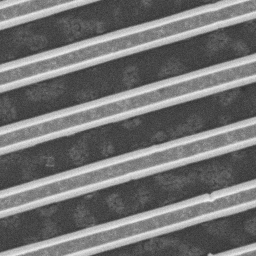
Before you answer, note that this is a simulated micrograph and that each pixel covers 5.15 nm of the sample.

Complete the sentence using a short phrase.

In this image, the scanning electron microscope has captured parallel lines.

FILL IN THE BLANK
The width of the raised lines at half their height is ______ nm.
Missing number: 101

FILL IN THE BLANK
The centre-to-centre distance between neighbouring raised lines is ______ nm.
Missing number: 311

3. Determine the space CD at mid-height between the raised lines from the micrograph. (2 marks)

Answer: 211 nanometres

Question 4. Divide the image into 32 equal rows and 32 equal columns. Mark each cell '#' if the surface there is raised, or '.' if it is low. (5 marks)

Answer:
.########...................####
######..................########
###..................#########..
..................########......
..............#########.........
..........#########.............
.......#########................
....#########..................#
#########..................#####
######..................########
##..................#########...
.................#########......
..............########..........
..........#########.............
.......########.................
...#########..................##
########...................#####
#####...................########
##..................#########...
................#########.......
.............#########..........
..........########..............
......#########.................
...#########..................##
########...................#####
#####..................#########
#...................########....
................#########.......
.............#########..........
.........#########..............
.....##########.................
..#########..................###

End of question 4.